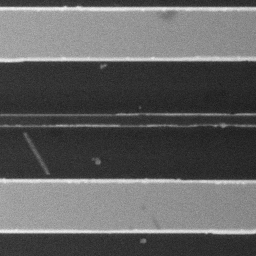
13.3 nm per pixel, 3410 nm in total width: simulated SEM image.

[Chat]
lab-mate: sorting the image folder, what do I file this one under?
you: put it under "lines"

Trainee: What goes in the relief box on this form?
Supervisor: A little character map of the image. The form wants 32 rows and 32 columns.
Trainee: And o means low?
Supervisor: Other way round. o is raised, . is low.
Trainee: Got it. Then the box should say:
................................
oooooooooooooooooooooooooooooooo
oooooooooooooooooooooooooooooooo
oooooooooooooooooooooooooooooooo
oooooooooooooooooooooooooooooooo
oooooooooooooooooooooooooooooooo
oooooooooooooooooooooooooooooooo
oooooooooooooooooooooo..........
................................
................................
................................
................................
................................
................................
oooooooooooooooooooooooooooooooo
oooooooooooooooooooooooooooooooo
................................
................................
................................
................................
................................
................................
ooooooooooooo...oooo............
oooooooooooooooooooooooooooooooo
oooooooooooooooooooooooooooooooo
oooooooooooooooooooooooooooooooo
oooooooooooooooooooooooooooooooo
oooooooooooooooooooooooooooooooo
oooooooooooooooooooooooooooooooo
................................
................................
................................